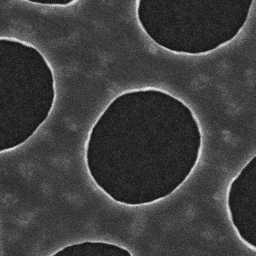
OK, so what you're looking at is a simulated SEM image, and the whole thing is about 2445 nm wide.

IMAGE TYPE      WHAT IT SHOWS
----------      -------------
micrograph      holes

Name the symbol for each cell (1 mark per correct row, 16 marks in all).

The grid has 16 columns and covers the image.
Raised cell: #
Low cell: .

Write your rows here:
#########.......
#########......#
.#########....##
...#############
...#############
...#############
...####.....####
...###......####
..####.......###
#####.......####
######......###.
######.....####.
#######...####..
##############..
###############.
####....########